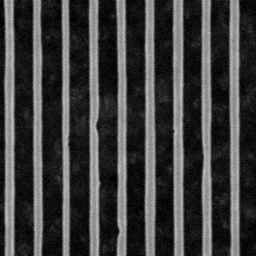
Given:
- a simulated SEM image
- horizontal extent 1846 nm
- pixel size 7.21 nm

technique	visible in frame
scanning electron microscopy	parallel lines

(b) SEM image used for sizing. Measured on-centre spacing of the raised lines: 203 nm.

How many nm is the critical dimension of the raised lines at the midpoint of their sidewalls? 58.6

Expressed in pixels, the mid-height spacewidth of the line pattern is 20.1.